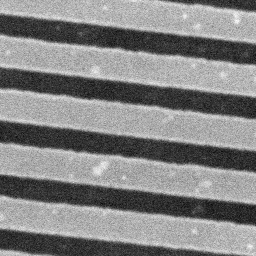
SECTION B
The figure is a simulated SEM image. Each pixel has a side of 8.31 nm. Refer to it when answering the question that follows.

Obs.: lines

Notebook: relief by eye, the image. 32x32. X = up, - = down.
XXXXXXXXXXXXXXXXXXXXXX----------
XXXXXXXXXXXXXXXXXXXXXXXXXXXXXX--
--------XXXXXXXXXXXXXXXXXXXXXXXX
----------------XXXXXXXXXXXXXXXX
X------------------------XXXXXXX
XXXXXXXX------------------------
XXXXXXXXXXXXXXXX----------------
XXXXXXXXXXXXXXXXXXXXXXXXXX------
--XXXXXXXXXXXXXXXXXXXXXXXXXXXXXX
----------XXXXXXXXXXXXXXXXXXXXXX
------------------XXXXXXXXXXXXXX
XXX------------------------XXXXX
XXXXXXXXXX----------------------
XXXXXXXXXXXXXXXXXXXX------------
XXXXXXXXXXXXXXXXXXXXXXXXXXXX----
-----XXXXXXXXXXXXXXXXXXXXXXXXXXX
-------------XXXXXXXXXXXXXXXXXXX
---------------------XXXXXXXXXXX
XXXX-------------------------XXX
XXXXXXXXXXXXX-------------------
XXXXXXXXXXXXXXXXXXXXX-----------
XXXXXXXXXXXXXXXXXXXXXXXXXXXXXX--
-------XXXXXXXXXXXXXXXXXXXXXXXXX
----------------XXXXXXXXXXXXXXXX
------------------------XXXXXXXX
XXXXXXX-------------------------
XXXXXXXXXXXXXXXXX---------------
XXXXXXXXXXXXXXXXXXXXXXXXXX------
XXXXXXXXXXXXXXXXXXXXXXXXXXXXXXXX
---------XXXXXXXXXXXXXXXXXXXXXXX
-----------------XXXXXXXXXXXXXXX
XX-------------------------XXXXX